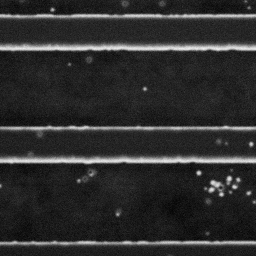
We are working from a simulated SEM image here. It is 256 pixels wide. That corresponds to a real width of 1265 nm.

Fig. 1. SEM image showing lines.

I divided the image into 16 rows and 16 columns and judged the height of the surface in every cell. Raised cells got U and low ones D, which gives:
DDDDDDDDDDDDDDDD
UUUUUUUUUUUUUUUU
UUUUUUUUUUUUUUUU
DDDDDDDDDDDDDDDD
DDDDDDDDDDDDDDDD
DDDDDDDDDDDDDDDD
DDDDDDDDDDDDDDDD
DDDDDDDDDDDDDDDD
UUUUUUUUUUUUUUUU
UUUUUUUUUUUUUUUU
DDDDDDDDDDDDDDDD
DDDDDDDDDDDDDDDD
DDDDDDDDDDDDDDDD
DDDDDDDDDDDDDDDD
DDDDDDDDDDDDDDDD
UUUUUUUUUUUUUUUU